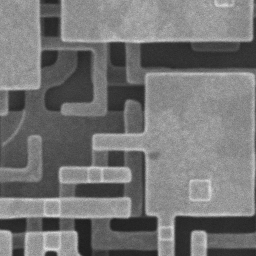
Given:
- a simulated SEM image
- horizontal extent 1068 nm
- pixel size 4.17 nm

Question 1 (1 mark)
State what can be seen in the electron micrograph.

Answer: wiring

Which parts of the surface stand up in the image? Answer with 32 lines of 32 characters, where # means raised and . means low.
#####..#########################
################################
#####...########################
#####...########################
#####..#########################
##############.###..............
#####.......#...##..............
#####.......#...##..............
#####.......#...##..............
#####.......#...################
#####.......#.....##############
#...........#.....##############
#...........#.....##############
#.......#####...################
..........###...################
................################
...............#################
....#.......####################
....#.......####################
....#.......#...################
...##......###..################
#####..#########################
#####..#########################
.......##.......################
.......###.....#################
################################
################################
...##..###.###......##..........
...##..##...##......##..........
##########..##########..########
##########..##########..########
##.###.###..........##..##......